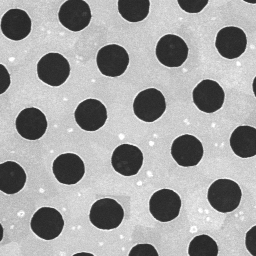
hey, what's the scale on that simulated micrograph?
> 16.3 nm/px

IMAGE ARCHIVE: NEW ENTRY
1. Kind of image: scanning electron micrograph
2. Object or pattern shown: a regular array of holes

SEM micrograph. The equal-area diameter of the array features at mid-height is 537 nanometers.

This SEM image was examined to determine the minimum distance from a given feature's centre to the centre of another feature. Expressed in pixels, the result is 58.2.